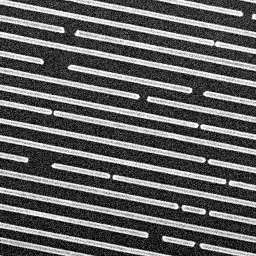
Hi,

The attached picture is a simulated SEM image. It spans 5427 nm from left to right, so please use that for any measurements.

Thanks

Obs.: parallel lines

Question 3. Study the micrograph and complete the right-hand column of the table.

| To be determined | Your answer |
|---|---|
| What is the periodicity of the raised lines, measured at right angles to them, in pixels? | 16.8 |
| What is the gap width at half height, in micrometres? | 0.263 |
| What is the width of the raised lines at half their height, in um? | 0.091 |